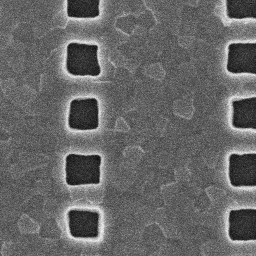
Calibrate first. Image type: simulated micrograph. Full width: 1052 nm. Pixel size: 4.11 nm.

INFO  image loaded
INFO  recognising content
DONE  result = holes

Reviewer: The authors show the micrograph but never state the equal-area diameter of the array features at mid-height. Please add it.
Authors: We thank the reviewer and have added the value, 144 nm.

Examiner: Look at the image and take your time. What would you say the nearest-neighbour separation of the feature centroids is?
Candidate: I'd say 0.221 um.